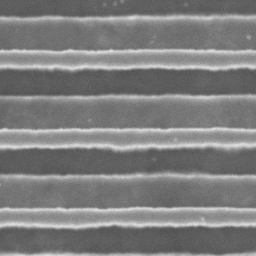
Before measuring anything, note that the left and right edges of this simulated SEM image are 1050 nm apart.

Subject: lines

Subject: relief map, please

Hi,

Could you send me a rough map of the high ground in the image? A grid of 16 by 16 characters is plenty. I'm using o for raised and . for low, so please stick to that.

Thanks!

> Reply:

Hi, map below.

................
oooooooooooooooo
oooooooooooooooo
oooooooooooooooo
................
................
oooooooooooooooo
oooooooooooooooo
oooooooooooooooo
................
................
oooooooooooooooo
oooooooooooooooo
oooooooooooooooo
................
................